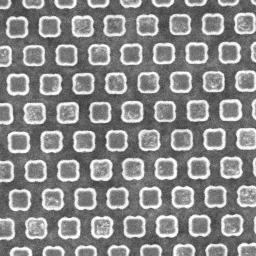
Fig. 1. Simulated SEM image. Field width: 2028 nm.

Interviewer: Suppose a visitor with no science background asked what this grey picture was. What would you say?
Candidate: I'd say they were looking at a regular array of raised bodies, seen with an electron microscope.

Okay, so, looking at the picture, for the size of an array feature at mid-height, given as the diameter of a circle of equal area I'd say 170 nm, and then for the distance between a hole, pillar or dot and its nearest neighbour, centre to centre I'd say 257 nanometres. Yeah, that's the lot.